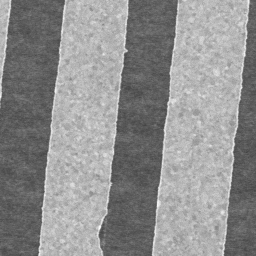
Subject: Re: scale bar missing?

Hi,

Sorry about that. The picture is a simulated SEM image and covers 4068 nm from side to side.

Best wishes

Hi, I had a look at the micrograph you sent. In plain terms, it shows one or a few lines or trenches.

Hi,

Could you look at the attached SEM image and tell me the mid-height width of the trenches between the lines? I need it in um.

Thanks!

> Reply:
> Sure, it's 0.804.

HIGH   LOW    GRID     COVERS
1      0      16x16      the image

1000111100011111
0000111100011110
0000111100011110
0000111100011110
0000111100011110
0001111000011110
0001111000011110
0001111000111110
0001111000111110
0001111000111110
0001111000111110
0001111000111100
0001111000111100
0001111000111100
0001110000111100
0011110000111100